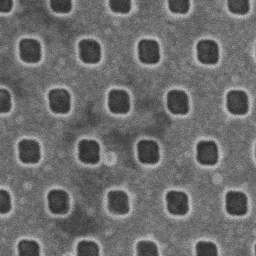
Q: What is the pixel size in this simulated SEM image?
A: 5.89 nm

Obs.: a regular array of holes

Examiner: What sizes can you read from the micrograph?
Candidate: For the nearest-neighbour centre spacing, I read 343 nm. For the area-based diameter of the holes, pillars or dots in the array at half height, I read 151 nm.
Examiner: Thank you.